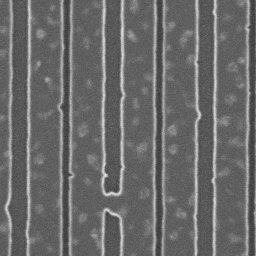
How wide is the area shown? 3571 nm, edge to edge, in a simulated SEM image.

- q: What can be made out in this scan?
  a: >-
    parallel lines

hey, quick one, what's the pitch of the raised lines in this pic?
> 649 nanometers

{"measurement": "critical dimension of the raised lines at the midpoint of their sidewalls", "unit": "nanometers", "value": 464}